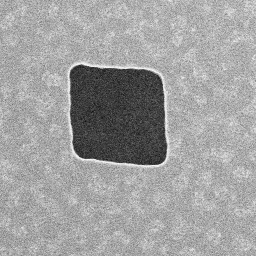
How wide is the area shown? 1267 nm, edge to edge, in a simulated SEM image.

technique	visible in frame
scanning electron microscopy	holes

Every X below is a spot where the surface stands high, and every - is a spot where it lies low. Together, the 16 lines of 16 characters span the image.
XXXXXXXXXXXXXXXX
XXXXXXXXXXXXXXXX
XXXXXXXXXXXXXXXX
XXXXXXXXXXXXXXXX
XXXX-----XXXXXXX
XXXX------XXXXXX
XXXX------XXXXXX
XXXX------XXXXXX
XXXXX-----XXXXXX
XXXXX-----XXXXXX
XXXXXXXXXXXXXXXX
XXXXXXXXXXXXXXXX
XXXXXXXXXXXXXXXX
XXXXXXXXXXXXXXXX
XXXXXXXXXXXXXXXX
XXXXXXXXXXXXXXXX